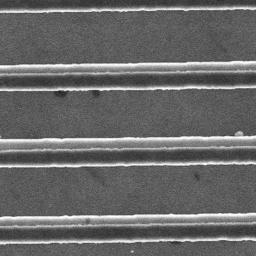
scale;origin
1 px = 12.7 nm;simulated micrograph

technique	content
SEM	lines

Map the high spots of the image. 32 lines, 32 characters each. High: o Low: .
oooooooooooooooooooooooooooooooo
oo..o...........................
................................
................................
................................
................................
................................
................................
oooooooooooooooooooooooooooooooo
oooooooooooooooooooooooooooooooo
oooooooooooooooooooooooooooooooo
................................
................................
................................
................................
................................
................................
..o.oooooooooooooooooooooooooooo
oooooooooooooooooooooooooooooooo
oooooooooooooooooooooooooooooooo
oooooooooooooooooo.oo...........
................................
................................
................................
................................
................................
................................
oooooooooooooooooooooooooooooooo
oooooooooooooooooooooooooooooooo
oooooooooooooooooooooooooooooooo
................................
................................